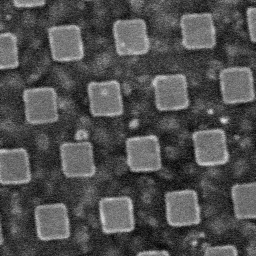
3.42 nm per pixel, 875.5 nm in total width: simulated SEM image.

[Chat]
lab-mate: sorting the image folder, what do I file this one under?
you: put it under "a regular array of raised bodies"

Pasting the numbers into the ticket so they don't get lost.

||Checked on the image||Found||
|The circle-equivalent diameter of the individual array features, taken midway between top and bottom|0.124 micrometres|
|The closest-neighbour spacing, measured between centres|223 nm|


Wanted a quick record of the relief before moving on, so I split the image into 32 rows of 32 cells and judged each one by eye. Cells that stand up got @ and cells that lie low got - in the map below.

--@@@---------------------------
-------------------------------@
-----------------------@@@-----@
-------@@@----@@@@-----@@@@----@
@@----@@@@----@@@@-----@@@@----@
@@----@@@@-----@@@-----@@@@-----
@@----@@@@-----@@@--------------
@@-----@@-----------------------
@-------------------------------
---------------------@@-----@@@-
-----------@@@@----@@@@-----@@@@
---@@@@----@@@@----@@@@-----@@@@
---@@@@----@@@@----@@@@-----@@@-
---@@@@----@@@@-----@@@---------
---@@@@-------------------------
--------------------------------
-------------------------@@@----
----------------@@@@----@@@@----
--------@@@-----@@@@----@@@@----
@@@-----@@@@----@@@@----@@@@----
@@@@----@@@@----@@@@-----@@-----
@@@@----@@@@--------------------
@@@@----------------------------
-----------------------------@@@
---------------------@@@@----@@@
-------------@@@-----@@@@----@@@
----@@@@-----@@@@----@@@@----@@@
-----@@@-----@@@@----@@@@-------
-----@@@@----@@@@---------------
-----@@@------------------------
--------------------------------
--------------------@-----@@@---